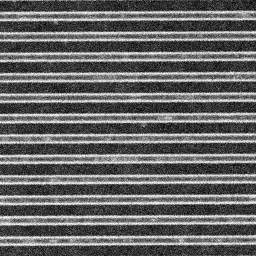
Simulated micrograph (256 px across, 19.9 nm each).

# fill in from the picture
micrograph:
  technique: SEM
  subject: parallel lines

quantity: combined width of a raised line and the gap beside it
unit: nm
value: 407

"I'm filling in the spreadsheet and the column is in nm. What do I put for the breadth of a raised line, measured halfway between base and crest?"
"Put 152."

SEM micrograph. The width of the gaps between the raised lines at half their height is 254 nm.